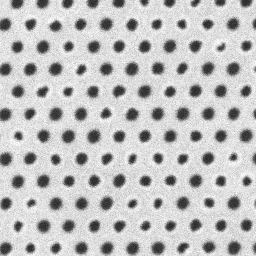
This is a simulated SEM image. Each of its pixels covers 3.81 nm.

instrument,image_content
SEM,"a regular array of holes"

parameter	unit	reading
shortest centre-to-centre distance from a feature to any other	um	0.0956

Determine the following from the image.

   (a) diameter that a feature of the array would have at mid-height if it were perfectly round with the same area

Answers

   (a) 44 nanometres